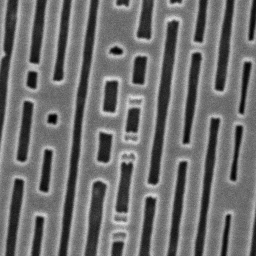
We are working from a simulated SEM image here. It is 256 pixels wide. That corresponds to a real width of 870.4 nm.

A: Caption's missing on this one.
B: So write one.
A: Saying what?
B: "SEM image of parallel lines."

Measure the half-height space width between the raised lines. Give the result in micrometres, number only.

0.0346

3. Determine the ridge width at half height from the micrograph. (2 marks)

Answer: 54.9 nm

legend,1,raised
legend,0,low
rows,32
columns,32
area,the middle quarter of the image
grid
11110001111111111000011100001110
11110001111111111000011100001110
11110001111111111000011100011110
11110011111111111000111100011110
11110011110000111000111100011110
11100011110000111111111100011110
11100011110000111111111100011110
11100011110000111111111000011110
11100011110000111111111000011110
11100111110000111111111000011100
11100111110001111111111000111100
11100111100001110001111000111100
11100111111111110001111000111100
11000111111111100001111000111100
11000111111111100001111000111100
11000111111111100001111000111100
11000111111111100001110001111100
11000111100011111111110001111100
11000111100011111111110001111100
11001111000011111111110001111100
11001111000011111111110001111111
11001111000011111111110001111111
11001111000011111111110001111111
10001111000011111111110001111111
10001111000111010111100011111001
10001111111111000111100011110001
10001111111111000111100011110001
10001111111111000111100011110001
10011111111111000111100011110001
10011110001111000111100011110001
10011110000111000111110111110011
00011110000110000111111111110011